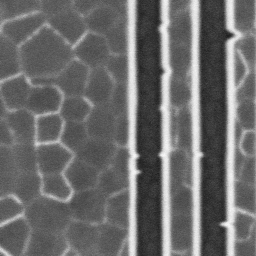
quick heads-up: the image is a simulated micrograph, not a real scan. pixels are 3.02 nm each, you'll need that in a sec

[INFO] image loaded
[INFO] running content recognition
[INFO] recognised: one or a few lines or trenches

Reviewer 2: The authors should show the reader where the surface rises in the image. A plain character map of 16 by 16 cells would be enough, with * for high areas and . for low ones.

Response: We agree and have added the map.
********..**..**
********..**..**
********..**...*
********..**..**
********..**..**
********..**..**
********..**..**
********..**..**
********..**..**
********..**..**
********..**..**
********..**..**
********..**..**
********..**..**
********..**..**
********..**..**